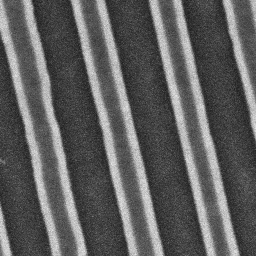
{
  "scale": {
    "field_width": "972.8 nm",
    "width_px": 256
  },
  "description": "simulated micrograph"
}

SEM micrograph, one or a few lines or trenches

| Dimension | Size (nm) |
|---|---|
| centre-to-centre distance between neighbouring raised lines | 283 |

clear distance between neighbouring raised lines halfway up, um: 0.188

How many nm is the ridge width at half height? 93.9